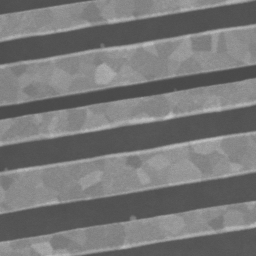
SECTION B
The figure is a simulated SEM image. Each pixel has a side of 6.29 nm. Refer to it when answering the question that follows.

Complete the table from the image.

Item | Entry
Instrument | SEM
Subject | lines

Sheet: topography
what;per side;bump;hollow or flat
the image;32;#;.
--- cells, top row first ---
.........####################...
..#####################.........
#################...............
##########...................###
####...................#########
.................###############
..........######################
....############################
##############################..
#######################.........
#################...........####
###########...........##########
#####..........#################
.........#####################..
...####################.........
#################...............
###########....................#
#####....................#######
...................#############
............####################
......##########################
################################
##########################......
###################.............
##############..................
#######......................###
#......................#########
.................###############
..........#####################.
.....####################.......
###################.............
#############...................